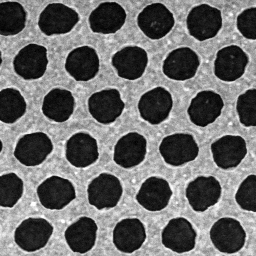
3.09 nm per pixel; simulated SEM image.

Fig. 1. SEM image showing a regular array of holes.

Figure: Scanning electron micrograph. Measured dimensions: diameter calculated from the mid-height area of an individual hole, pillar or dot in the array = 110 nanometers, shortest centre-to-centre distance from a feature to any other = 149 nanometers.